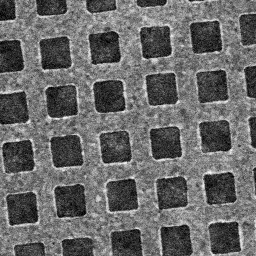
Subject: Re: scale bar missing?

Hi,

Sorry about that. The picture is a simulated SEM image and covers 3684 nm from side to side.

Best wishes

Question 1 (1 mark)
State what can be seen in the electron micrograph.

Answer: a regular array of holes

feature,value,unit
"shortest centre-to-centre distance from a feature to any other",0.7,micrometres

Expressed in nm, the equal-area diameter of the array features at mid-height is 510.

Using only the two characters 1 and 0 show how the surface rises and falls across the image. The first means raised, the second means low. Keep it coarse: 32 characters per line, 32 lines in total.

00110000111000011000011111111111
00111000111001111111111111111111
00111111111111111111111111011100
11111111111111111100011100001100
11111111111000011000011100001100
00011000011000011100001100001100
00011000011000011100001100011111
00011000011000011111111111111111
00011000011111111111111111111110
11111111111111111100001110001110
11111111111100011100001110001110
10011100001100001100001110000110
00011100001100001100001110001111
00001100001100001111111111111111
00001100011111111111111111111111
00111111111111111111111110000110
11111111111110001110000110000110
11101100001100001110000110000110
00001100001100001110000110000111
00001100001110001110000111111111
00001110001110111111111111111111
10011111111111111111111111100111
11111111111111000111000110000111
11111110001110000110000110000111
10000110000110000111000111000011
10000110000110000111000111001111
10000110000111001111111111111111
10000111111111111111111111111111
11111111111111111111000011000011
11111111111111000011000011000011
11000111000011000011000011000011
11000011000011000011000011100011